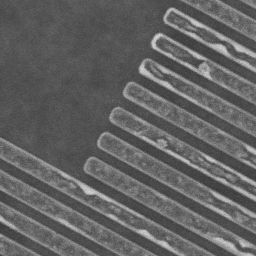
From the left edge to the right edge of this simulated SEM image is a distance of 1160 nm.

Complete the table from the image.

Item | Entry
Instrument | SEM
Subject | parallel lines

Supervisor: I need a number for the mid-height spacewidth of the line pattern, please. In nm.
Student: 51.6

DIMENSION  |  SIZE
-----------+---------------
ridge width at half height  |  78 nm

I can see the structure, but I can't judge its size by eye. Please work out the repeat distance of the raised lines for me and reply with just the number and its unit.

127 nm